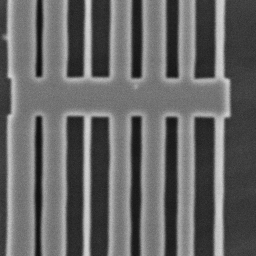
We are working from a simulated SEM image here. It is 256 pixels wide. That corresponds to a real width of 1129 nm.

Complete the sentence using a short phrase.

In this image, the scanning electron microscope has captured groups of lines, slits or small figures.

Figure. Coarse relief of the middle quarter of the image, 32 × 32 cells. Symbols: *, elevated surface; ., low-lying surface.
*....**.....*****...*****....***
*....**.....*****...*****....***
.....**.....*****...*****....***
*....**....******..*******..****
********************************
********************************
********************************
********************************
********************************
********************************
********************************
********************************
********************************
.....**....******...*****...****
.....**.....*****..******....***
.....*......*****..******....***
.....*......*****..******....***
.....*......*****..******....***
.....*......*****..******....***
.....*......*****..******....***
.....*......*****..******....***
.....*......*****..******....***
.....*......*****..******....***
.....*......*****..******....***
.....*......*****..******....***
.....*......*****..******....***
.....*......*****..******....***
.....*......*****..******....***
.....*......*****..******....***
.....*......*****..******....***
.....*......*****..******....***
.....*......*****..******....***